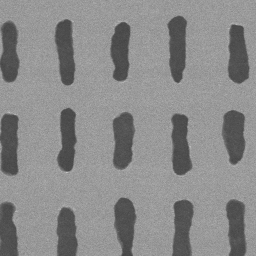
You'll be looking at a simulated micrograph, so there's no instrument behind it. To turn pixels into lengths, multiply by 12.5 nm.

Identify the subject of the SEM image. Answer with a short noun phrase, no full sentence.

a regular array of holes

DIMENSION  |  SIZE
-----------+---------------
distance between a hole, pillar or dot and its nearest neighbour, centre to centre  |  0.699 um